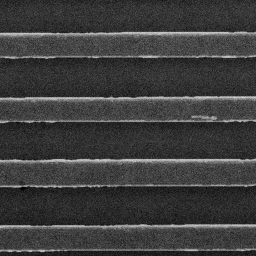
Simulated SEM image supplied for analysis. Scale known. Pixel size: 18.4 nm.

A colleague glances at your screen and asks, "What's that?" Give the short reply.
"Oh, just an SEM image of lines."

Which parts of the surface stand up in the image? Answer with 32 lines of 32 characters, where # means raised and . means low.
................................
................................
................................
................................
################################
################################
################################
................................
................................
................................
................................
................................
################################
################################
################################
................................
................................
................................
................................
................................
################################
################################
################################
................................
................................
................................
................................
................................
################################
################################
################################
................................